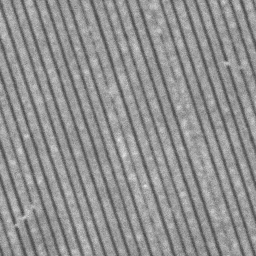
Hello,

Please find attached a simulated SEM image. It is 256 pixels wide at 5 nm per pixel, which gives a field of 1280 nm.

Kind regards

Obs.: parallel lines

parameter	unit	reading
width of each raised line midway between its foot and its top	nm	38.6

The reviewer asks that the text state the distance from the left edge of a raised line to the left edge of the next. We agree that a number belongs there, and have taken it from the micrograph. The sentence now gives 0.0548 µm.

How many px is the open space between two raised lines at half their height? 2.96